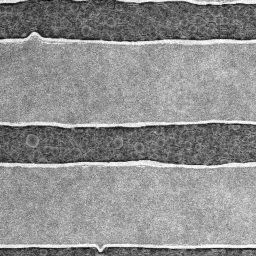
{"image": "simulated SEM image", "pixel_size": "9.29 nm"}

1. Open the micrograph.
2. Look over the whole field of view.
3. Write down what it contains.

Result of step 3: one or a few lines or trenches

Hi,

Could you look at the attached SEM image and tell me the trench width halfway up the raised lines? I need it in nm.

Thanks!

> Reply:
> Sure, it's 373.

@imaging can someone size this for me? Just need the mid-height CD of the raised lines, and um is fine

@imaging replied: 0.76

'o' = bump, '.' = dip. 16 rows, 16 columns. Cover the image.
................
................
.ooo............
oooooooooooooooo
oooooooooooooooo
oooooooooooooooo
oooooooooooooooo
oooooooooooooooo
................
................
oooooooooooooooo
oooooooooooooooo
oooooooooooooooo
oooooooooooooooo
oooooooooooooooo
................